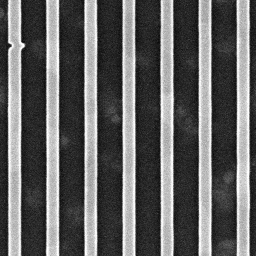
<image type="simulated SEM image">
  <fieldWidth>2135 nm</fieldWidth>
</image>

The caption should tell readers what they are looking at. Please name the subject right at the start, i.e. parallel lines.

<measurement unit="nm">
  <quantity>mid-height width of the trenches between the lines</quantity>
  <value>223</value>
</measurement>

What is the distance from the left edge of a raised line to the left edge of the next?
318 nm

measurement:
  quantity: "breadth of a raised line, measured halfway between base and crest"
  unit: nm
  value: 93.8